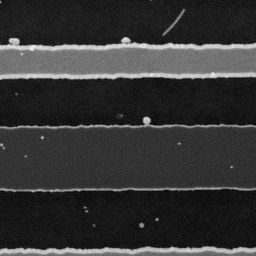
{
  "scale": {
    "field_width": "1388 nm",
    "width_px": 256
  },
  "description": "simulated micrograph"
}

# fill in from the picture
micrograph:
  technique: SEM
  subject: lines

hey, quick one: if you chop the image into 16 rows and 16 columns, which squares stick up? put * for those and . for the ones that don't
................
................
................
****************
****************
................
................
................
****************
****************
****************
****************
................
................
................
................